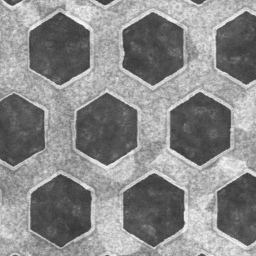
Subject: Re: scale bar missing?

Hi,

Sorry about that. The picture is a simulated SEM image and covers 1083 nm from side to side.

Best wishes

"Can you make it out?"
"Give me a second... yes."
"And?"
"holes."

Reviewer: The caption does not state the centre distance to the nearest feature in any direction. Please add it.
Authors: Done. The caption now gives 393 nanometers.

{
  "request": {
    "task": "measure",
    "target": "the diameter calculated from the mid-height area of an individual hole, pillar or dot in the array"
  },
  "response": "281 nanometres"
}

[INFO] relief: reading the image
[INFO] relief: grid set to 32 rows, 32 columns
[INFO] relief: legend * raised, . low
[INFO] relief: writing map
*.***********.**********.*******
*******.**********************.*
******...********....********...
****.......*****.......****.....
****.......****........****.....
****.......****........****.....
****.......****........****.....
****.......****........****.....
****.......*****.......****.....
*****.....*******....********...
*******.**********..**********.*
********************************
...*********...********....*****
.....*****.......*****.......***
......***........****........***
......***........****........***
......***........****........***
......***........****........***
......***........****........***
....*******.....*******....*****
*.***********.**********..******
********************************
******...*********...********...
*****......*****.......*****....
****.......****........****.....
****........***........****.....
****........***........****.....
****.......****........****.....
****.......****........****.....
*****.....*******.....*******...
*******.**********..**********..
********************************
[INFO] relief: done